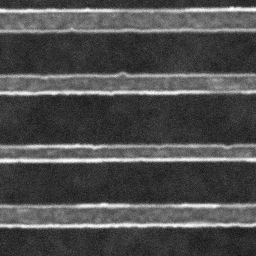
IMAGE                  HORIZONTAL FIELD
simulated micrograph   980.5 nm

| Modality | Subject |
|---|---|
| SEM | one or a few lines or trenches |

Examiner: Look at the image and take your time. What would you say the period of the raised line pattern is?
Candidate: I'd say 0.248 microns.